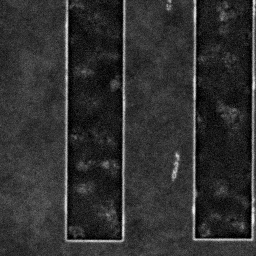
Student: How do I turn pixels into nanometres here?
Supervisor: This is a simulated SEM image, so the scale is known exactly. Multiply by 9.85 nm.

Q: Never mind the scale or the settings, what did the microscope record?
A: one or a few lines or trenches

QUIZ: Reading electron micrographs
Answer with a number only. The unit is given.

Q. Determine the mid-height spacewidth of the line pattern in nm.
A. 564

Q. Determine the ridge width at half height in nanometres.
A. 705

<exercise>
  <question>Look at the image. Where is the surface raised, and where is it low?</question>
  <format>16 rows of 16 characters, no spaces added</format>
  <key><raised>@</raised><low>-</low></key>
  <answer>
@@@@----@@@@----
@@@@----@@@@----
@@@@----@@@@----
@@@@----@@@@----
@@@@----@@@@----
@@@@----@@@@----
@@@@----@@@@----
@@@@----@@@@----
@@@@----@@@@----
@@@@----@@@@----
@@@@----@@@@----
@@@@----@@@@----
@@@@----@@@@----
@@@@----@@@@----
@@@@----@@@@----
@@@@@@@@@@@@@@@@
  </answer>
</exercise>